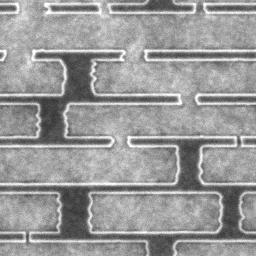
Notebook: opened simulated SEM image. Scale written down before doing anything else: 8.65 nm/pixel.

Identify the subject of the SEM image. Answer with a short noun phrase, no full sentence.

parallel lines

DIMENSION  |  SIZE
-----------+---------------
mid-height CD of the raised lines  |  85.4 nm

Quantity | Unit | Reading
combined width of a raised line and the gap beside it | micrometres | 0.392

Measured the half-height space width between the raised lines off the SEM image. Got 37.2 px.